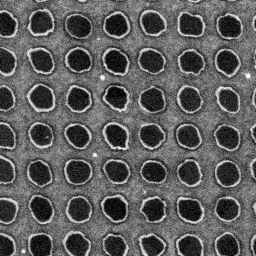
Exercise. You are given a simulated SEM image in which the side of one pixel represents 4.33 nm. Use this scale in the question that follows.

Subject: a regular array of raised bodies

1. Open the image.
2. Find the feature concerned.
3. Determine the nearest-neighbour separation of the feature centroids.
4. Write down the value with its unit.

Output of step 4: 156 nm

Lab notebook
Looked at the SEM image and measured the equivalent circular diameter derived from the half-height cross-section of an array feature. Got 110 nm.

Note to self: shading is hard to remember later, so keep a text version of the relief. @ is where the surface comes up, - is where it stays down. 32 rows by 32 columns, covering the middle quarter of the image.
-@@@@@@---@@@@@@---@@@@@@----@@@
--@@@@-----@@@@@----@@@@@----@@@
--------------@-----------------
--------------------------------
--------------------------------
------------@@------------------
-@@@@------@@@@-----@@@@-----@@@
-@@@@@----@@@@@@---@@@@@@----@@@
-@@@@@@---@@@@@@---@@@@@@---@@@@
-@@@@@@----@@@@@---@@@@@@----@@@
-@@@@@@----@@@@@---@@@@@@----@@@
--@@@--------@@-----@@@@@-----@@
--------------------------------
--------------------------------
--------------------------------
-@@@@-----@@@@-----@@@@@------@@
@@@@@@----@@@@@@---@@@@@----@@@@
@@@@@@@---@@@@@@---@@@@@@---@@@@
-@@@@@@----@@@@@---@@@@@@---@@@@
-@@@@@-----@@@@@---@@@@@-----@@@
--@@@@------@@@@----@@@-------@@
--------------------------------
--------------------------------
--------------------------------
-@@@@@-----@@@@------@@-------@@
@@@@@@@---@@@@@@----@@@@@----@@@
@@@@@@@---@@@@@@---@@@@@@@--@@@@
@@@@@@@---@@@@@@---@@@@@@@--@@@@
-@@@@@@----@@@@@----@@@@@----@@@
-@@@@@------@@@------@@@@----@@@
-------------------------------@
--------------------------------